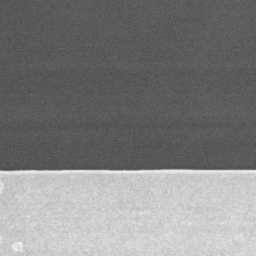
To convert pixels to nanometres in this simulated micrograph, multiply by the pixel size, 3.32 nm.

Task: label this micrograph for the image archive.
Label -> wiring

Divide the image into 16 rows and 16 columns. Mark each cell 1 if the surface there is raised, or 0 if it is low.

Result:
0000000000000000
0000000000000000
0000000000000000
0000000000000000
0000000000000000
0000000000000000
0000000000000000
0000000000000000
0000000000000000
0000000000000000
0000000000000000
1111111111111111
1111111111111111
1111111111111111
1111111111111111
1111111111111111